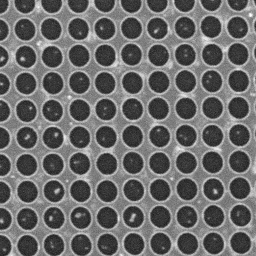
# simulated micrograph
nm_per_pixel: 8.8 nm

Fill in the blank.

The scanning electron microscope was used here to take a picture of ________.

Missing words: a regular array of holes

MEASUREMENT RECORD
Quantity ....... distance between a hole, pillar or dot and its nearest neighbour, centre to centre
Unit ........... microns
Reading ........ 0.232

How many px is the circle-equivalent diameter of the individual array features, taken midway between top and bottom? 22.1